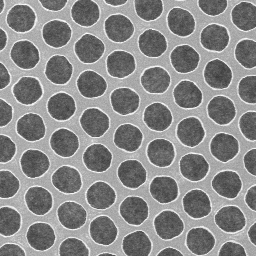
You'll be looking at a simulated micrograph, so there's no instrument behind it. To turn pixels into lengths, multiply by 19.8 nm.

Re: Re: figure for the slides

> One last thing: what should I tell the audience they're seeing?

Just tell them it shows a regular array of holes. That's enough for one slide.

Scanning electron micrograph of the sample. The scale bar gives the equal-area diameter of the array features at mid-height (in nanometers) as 566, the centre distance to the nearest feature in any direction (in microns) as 0.708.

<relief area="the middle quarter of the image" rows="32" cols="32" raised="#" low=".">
..#########.......#########.....
..#########.......##.....###....
..##.....##......###......######
..#.......####.####........#####
.##........########........##...
###........#########......##....
####......###....###......#.....
.###......##......#########.....
..####.#####.......#########....
...#########.......#########....
...#########.......##.....###...
...##....####.....##......######
..###.....####..####.......#####
..##.......#########.......####.
####.......#########.......##...
####.......###....###.....##....
.####......##......###...###....
...###....###.......########....
...#########........#########...
....#########.......##.....##...
....##....###......##......####.
...###.....####...###.......####
..###.......#########.......###.
#####.......#########.......#...
#####.......###....###.....##...
.####......###......###...###...
...####...###.......#########...
....#########........########...
....##########.......#.....###..
....####..####......##......####
....###.....###....##.......####
....##......#########........###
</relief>